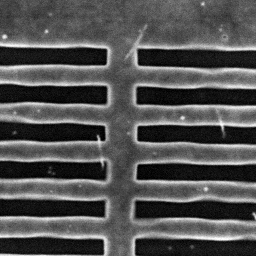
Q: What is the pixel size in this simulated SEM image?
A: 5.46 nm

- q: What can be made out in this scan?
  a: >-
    groups of lines, slits or small figures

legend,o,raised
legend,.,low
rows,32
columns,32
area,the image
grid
oooooooooooooooooooooooooooooooo
oooooooooooooooooooooooooooooooo
oooooooooooooooooooooooooooooooo
oooooooooooooooooooooooooooooooo
oooooooooooooooooooooooooooooooo
oooooooooooooooooooooooooooooooo
.............oooo...............
.............oooo...............
ooooooooooooooooooooooo.........
oooooooooooooooooooooooooooooooo
..oooooooooooooooooooooooooooooo
..............ooo...............
..............ooo...............
oooooooooooooooooooooooooooooooo
oooooooooooooooooooooooooooooooo
...........ooooooooo..oooo.ooooo
.............oooo...............
.............oooo...............
oooooooooooooooooooooooooooooooo
oooooooooooooooooooooooooooooooo
.............ooooo.......oooooo.
..............ooo...............
...ooo...oo..oooo...............
oooooooooooooooooooooooooooooooo
oooooooooooooooooooooooooooooooo
.............oooo...............
.............oooo...............
ooooooooooooooooo..ooooooo......
oooooooooooooooooooooooooooooooo
ooooo.ooooooooooooo.oooooooooooo
.............oooo...............
.............oooo...............